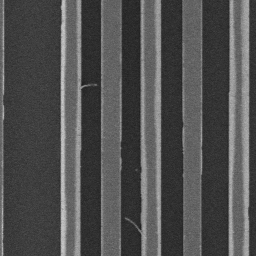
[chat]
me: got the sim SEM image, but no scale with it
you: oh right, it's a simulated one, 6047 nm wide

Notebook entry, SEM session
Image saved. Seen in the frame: lines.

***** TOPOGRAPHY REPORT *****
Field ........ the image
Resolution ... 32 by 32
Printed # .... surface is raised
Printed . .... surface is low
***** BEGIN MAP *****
........##...##...##...##....##.
........##...##...##...##....##.
........##...##...##...##....##.
........##...##...##...##....##.
........##...##...##...##....##.
........##...##...##...##....##.
........##...##...##...##....##.
........##...##...##...##....##.
........##...##...##...##....##.
........##...##...##...##....##.
........##...##...##...##....##.
........##...##...##...##....##.
........##...##...##...##....##.
........##...##...##...##....##.
........##...##...##...##....##.
........##...##...##...##....##.
........##...##...##...##....##.
........##...##...##...##....##.
........##...##...##...##....##.
........##...##...##...##....##.
........##...##...##...##....##.
........##...##...##...##....##.
........##...##...##...##....##.
........##...##...##...##....##.
........##...##...##...##....##.
........##...##...##...##....##.
........##...##...##...##....##.
........##...##...##...##....##.
........##...##...##...##....##.
........##...##...##...##....##.
........##...##...##...##....##.
........##...##...##...##....##.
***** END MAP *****